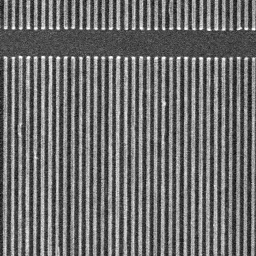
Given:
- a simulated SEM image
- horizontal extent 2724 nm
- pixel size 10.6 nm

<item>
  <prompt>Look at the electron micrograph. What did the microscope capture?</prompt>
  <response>parallel lines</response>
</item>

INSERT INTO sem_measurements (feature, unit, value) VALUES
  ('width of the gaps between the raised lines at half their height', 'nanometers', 55.8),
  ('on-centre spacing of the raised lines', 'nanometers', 79.9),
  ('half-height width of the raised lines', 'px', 2.62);